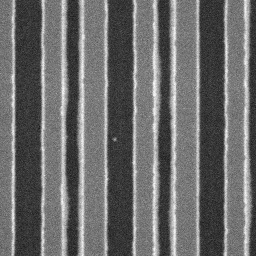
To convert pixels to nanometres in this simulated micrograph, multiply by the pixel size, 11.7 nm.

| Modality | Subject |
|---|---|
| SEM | lines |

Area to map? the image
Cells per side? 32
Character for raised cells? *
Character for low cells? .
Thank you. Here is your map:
**...***..***....**...***...***.
**...***..***....**...***...***.
**...***..***....**...***...***.
**...***..***....**...***...***.
**...***..***....**...***...***.
**...***..***....**...***...***.
**...***..***....**...***...***.
**...***..***....***..***...***.
**...***..***....***..***...***.
**...***..***....***..***...***.
**...***..***....***..***...***.
**...***..***....***..***...***.
**...***..***....***..***...***.
**...***..***....***..***...***.
**...***..***....**...***...***.
**...***..***....**...***...***.
**...***..***....**...***...***.
**...***..***....**...***...***.
**...***..***....**...***...***.
**...***..***....**...***...***.
**...***..***....**...***...***.
**...***..***....**...***...***.
**...***..***....**...***...***.
**...***..***....**...***...***.
**...***..***....**...***...***.
**...***..***....**...***...***.
**...***..***....**...***...***.
**...***..***....**...***...***.
**...***..***....**...***...***.
**...***..***....**...***...***.
**...***..***....**...***...***.
**...***..***....**...***...***.